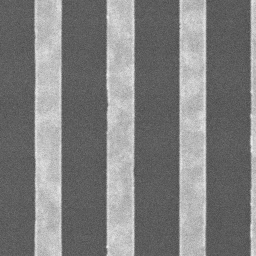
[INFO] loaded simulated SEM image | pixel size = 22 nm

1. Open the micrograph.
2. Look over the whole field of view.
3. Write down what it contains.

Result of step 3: one or a few lines or trenches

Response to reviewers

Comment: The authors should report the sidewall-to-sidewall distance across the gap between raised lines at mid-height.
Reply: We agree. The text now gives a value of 1030 nm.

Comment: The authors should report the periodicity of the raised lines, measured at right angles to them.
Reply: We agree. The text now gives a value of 1590 nm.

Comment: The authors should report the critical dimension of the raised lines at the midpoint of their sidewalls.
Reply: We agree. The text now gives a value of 550 nanometers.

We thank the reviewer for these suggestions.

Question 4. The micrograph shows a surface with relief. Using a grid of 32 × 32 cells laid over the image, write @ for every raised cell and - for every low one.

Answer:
-----@@@------@@@------@@@------
-----@@@------@@@------@@@------
----@@@@------@@@------@@@------
----@@@@------@@@------@@@------
-----@@@------@@@------@@@------
-----@@@------@@@------@@@------
-----@@@------@@@------@@@------
-----@@@------@@@------@@@------
-----@@@-----@@@@------@@@------
-----@@@-----@@@@------@@@------
-----@@@-----@@@@------@@@------
-----@@@------@@@-------@@------
-----@@@------@@@------@@@------
-----@@@------@@@------@@@------
-----@@@------@@@------@--------
-----@@@------@@@------@--------
-----@@@------@@@------@@@------
-----@@@------@@@------@@@------
-----@@@------@@@------@@@------
-----@@@------@@@------@@@------
-----@@@------@@@------@@@------
-----@@@------@@@------@@@------
-----@@@------@@@------@@@------
-----@@@------@@@------@@@------
-----@@@------@@@------@@@------
-----@@@------@@@------@@@------
-----@@@------@@@------@@@------
-----@@@------@@@------@@@------
-----@@@------@@@------@@@------
-----@@@------@@@------@@@------
-----@@@------@@@------@@@------
-----@@@------@@@------@@@------